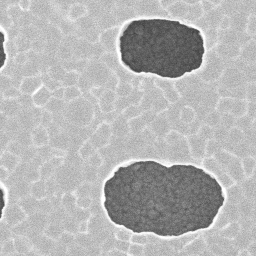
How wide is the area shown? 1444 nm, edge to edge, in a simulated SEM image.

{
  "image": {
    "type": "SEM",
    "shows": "holes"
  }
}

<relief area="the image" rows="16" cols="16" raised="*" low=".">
****************
********....****
*******......***
********.....***
*********...****
****************
****************
****************
****************
****************
*******.....****
*******.......**
*******.......**
*******......***
*********...****
****************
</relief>